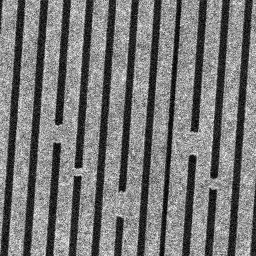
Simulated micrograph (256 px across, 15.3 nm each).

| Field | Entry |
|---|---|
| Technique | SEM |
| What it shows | parallel lines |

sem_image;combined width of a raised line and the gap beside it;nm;346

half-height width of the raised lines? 226 nanometers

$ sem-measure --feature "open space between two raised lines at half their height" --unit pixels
7.86